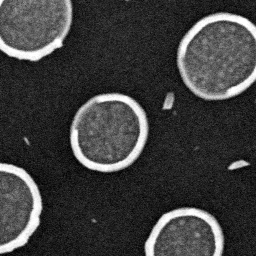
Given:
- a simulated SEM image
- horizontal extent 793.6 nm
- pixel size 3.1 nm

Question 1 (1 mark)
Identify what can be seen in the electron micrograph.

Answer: raised bodies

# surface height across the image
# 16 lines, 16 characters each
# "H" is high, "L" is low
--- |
HHHHLLLLLLLLLLLL
HHHHLLLLLLLLHHHH
HHHHLLLLLLLHHHHH
LHHLLLLLLLLHHHHH
LLLLLLLLLLLHHHHH
LLLLLLLLLLLLHHHL
LLLLLHHHHLLLLLLL
LLLLLHHHHLLLLLLL
LLLLHHHHHLLLLLLL
LLLLLHHHHLLLLLLL
HLLLLLHHLLLLLLLL
HHLLLLLLLLLLLLLL
HHHLLLLLLLLLLLLL
HHHLLLLLLLHHHLLL
HHLLLLLLLHHHHHLL
HLLLLLLLLHHHHHLL